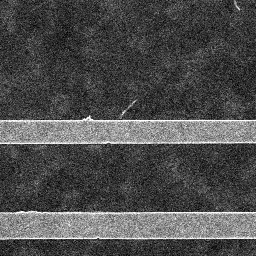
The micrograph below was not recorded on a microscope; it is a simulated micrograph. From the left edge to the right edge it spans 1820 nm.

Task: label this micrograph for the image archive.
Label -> one or a few lines or trenches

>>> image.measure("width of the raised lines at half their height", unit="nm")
182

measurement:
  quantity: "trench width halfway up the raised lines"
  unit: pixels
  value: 68.8